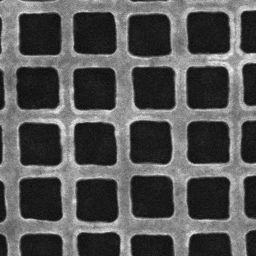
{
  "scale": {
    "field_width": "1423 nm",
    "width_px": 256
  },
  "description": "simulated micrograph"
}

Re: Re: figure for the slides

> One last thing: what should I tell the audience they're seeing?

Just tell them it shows a regular array of holes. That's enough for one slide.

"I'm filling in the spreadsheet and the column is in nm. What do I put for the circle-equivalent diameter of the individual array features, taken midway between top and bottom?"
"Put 264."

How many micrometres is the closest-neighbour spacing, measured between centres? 0.303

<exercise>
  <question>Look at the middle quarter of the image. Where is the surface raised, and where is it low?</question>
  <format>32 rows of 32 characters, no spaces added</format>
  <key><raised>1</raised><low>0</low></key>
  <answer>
11111111111111111111111100111111
11000000000011111000000000011110
11000000000001111000000000001100
11000000000001111000000000001100
11000000000001111000000000001100
11000000000001111000000000001110
11000000000001111000000000001100
11000000000001111000000000001110
11000000000001111000000000001110
11100000000001111000000000001110
11100000000001111100000000001110
11100011110011111110111000111111
11111111111111111111111111111111
11111111111111111111111111111111
11111000011111111000000000111111
11100000000001110000000000011110
11000000000001110000000000011110
11000000000001110000000000011110
11000000000001110000000000011110
11000000000001110000000000011110
11000000000001110000000000011110
11000000000001110000000000011110
11100000000001110000000000011110
11100000000001110000000000011110
11100000000001111000000000111110
11111111100011111111111111111111
11111111111111111111111111111111
11111111111111111111111111111111
11111111111011111000000000011111
11100000000001111000000000011110
11100000000001111000000000011110
11100000000001111000000000011110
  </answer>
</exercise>